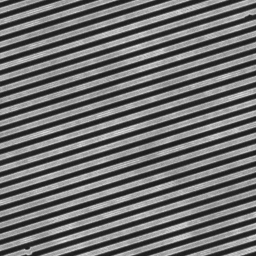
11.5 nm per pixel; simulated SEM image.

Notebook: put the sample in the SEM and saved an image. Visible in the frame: parallel lines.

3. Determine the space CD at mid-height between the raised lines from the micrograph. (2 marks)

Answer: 59.1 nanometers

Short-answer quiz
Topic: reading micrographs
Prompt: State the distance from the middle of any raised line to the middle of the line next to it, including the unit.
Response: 124 nm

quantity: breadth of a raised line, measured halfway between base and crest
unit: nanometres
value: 68.7